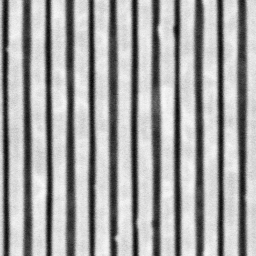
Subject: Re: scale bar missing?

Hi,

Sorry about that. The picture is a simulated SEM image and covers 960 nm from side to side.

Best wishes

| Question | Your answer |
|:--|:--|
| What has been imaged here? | parallel lines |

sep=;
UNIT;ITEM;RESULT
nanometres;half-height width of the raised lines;53.5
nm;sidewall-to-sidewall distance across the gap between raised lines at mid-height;26.7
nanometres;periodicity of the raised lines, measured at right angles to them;80.7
